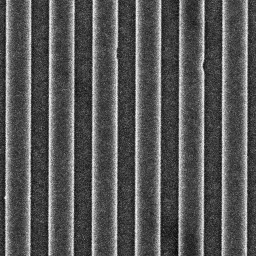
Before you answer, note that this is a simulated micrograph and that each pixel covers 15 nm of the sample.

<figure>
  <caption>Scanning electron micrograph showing parallel lines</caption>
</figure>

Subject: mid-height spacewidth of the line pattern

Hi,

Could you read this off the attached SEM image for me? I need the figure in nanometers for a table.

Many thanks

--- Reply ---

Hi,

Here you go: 282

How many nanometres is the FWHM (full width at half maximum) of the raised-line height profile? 366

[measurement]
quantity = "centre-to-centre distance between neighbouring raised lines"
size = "649 nanometers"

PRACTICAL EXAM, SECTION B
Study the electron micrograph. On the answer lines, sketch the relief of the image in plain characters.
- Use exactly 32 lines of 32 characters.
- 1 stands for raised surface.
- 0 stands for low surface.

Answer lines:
01110011100011100111001110001110
01110011100011100111001110001110
01110011100011100111001110001110
01110011100011100111001110001110
01110011100011100111001110001110
01110011100011100111001110001110
01110011100011000111001110001110
01110011100011100111001110001110
01110011100011100111001110001110
01110011100011100111001110001110
01110011100011100111001110001110
01110011100011100111001110001110
01110011100011100111001110001110
01110011100011100111001110001110
01110011100011100111001110001110
01110011100011100111001110001110
01110011100011100111001110001110
01110011100011100111001110001110
01110011100011100111001110001110
01110011100011100111001110001110
01110011100011100111001110001110
01110011100011100111001110001110
01110011100011100111001110001110
01110011100011100111001110001110
01110011100011100111001110001110
01110011100011100111001110001110
01110011100011100111001110001110
01110011100011100111001110001110
01110011100011100111001110001110
01110011100011100111001110001110
01110011100011100111001110001110
01110011100011100111001110001110